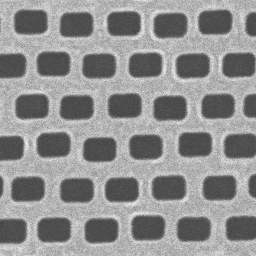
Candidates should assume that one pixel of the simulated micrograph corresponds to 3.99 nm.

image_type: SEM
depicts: a regular array of holes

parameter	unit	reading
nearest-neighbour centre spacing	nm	181